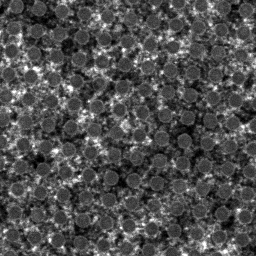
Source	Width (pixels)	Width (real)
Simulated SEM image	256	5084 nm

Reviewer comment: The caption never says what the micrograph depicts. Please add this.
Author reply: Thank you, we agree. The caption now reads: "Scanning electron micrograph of a regular array of raised bodies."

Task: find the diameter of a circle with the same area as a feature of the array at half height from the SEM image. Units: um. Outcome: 0.281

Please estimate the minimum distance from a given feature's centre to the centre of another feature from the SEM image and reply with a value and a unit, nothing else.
449 nanometres